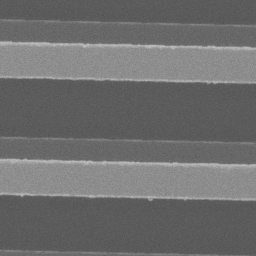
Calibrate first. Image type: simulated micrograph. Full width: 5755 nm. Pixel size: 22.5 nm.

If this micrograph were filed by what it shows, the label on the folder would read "lines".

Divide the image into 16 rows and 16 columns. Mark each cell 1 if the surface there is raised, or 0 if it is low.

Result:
0000000000000000
1111111111100000
1111111111111111
1111111111111111
1111111111111111
0000000000000000
0000000000000000
0000000000000000
0000000000000000
1111111111111111
1111111111111111
1111111111111111
0000000000000001
0000000000000000
0000000000000000
0000000000000000